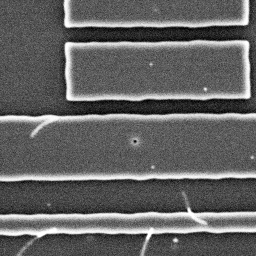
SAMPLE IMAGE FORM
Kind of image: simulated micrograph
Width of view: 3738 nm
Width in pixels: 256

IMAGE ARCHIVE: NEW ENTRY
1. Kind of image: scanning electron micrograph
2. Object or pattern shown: groups of lines, slits or small figures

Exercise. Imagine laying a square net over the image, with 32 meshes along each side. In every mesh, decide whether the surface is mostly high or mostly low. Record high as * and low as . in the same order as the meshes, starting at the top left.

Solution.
........***********************.
........***********************.
........***********************.
................................
................................
.........**********************.
........***********************.
........***********************.
........***********************.
........***********************.
........***********************.
........***********************.
.........****...**..............
................................
...........*********************
********************************
********************************
********************************
********************************
********************************
********************************
********************************
***.****........................
................................
................................
................................
................................
********************************
********************************
................................
................................
................................